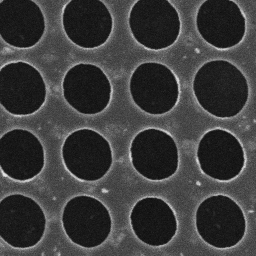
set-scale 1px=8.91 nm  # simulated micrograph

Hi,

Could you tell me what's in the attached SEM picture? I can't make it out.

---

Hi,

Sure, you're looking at a regular array of holes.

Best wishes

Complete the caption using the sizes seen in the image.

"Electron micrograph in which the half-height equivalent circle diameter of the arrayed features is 445 nm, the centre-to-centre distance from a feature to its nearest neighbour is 590 nm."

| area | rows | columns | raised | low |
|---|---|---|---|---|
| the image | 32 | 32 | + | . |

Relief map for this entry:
.....+++.....++++....++++....+++
.....+++......++......+++.....++
.....+++......++......+++......+
......++......++......+++......+
.....++++.....+++.....+++.....++
+...+++++....+++++...+++++....++
++++++++++++++++++++++++++++++++
+++++++++++++++++++++++++++.++++
....+++++...+++++....++++.....++
.....+++.....+++......++......++
......++......++......++.......+
......++......++......++.......+
......++......+++.....+++......+
+....++++....+++++...++++.....++
+++++++++++++++++++++++++++..+++
++++++++++++++++++++++++++++++++
+...+++++...++++++..++++++..++++
.....+++.....++++.....+++.....++
.....+++......++......+++.....++
......++......++......+++......+
.....+++......+++.....+++......+
+....++++....++++.....++++....++
++.++++++++.++++++++++++++++++++
++++++++++++++++++++++++++++++++
+..+++++++.++++++++++++++++.++++
.....+++.....++++....++++.....++
.....+++......++......+++.....++
......++......++......++.......+
......++......+++.....+++......+
.....++++....++++.....+++.....++
+....+++++...+++++...+++++....++
++++++++++++++++++++++++++++++++